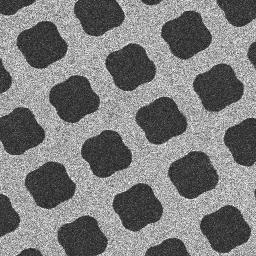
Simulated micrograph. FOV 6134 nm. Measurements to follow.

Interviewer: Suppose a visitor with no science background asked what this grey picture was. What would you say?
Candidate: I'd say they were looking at a regular array of holes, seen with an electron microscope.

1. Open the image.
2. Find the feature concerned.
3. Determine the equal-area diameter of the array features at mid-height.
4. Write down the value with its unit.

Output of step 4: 1110 nm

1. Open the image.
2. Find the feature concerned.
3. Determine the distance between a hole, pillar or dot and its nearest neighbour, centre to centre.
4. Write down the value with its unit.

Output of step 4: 1.49 µm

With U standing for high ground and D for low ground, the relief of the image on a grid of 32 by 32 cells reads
DDDDUUUUUDDDDDDUUUDDUUUUUUUDDDDD
DDUUUUUUUDDDDDDUUUUUUUUDDUUUDDDD
UUUUUUUUUUDDDDDDUUUUUDDDDUUUDDDD
UUUUDDDUUUDDDDUUUUUUDDDDDDUUUUUU
UUDDDDDDUUUDDUUUUUUUDDDDDDUUUUUU
UUDDDDDDUUUUUUUUDUUUUDDDDDUUUUUD
UUUDDDDDUUUUUUDDDDUUUDDDDUUUUUUD
UUUDDDDUUUUUUDDDDDDUUUUUUUUUUUUD
DUUUDDUUUUUUUDDDDDDUUUUUUUDDDUUU
DUUUUUUUUDUUUUDDDDDUUUUUUDDDDDUU
DUUUUUUDDDDUUUDDDDUUUUUUDDDDDDUU
UUUUUUDDDDDDUUUUUUUUUUUUDDDDDDUU
UUUUUUDDDDDDUUUUUUUDDDUUUDDDDDUU
UUDUUUUDDDDDUUUUUUDDDDUUUUDDUUUU
DDDDUUUDDDDUUUUUUDDDDDDUUUUUUUUU
DDDDDUUUUUUUUUUUUDDDDDDUUUUUUUDD
DDDDDDUUUUUUUDDUUUDDDDDUUUUUDDDD
DDDDDUUUUUUDDDDUUUUDDUUUUUUUDDDD
UDDDUUUUUUDDDDDDUUUUUUUUUUUUDDDD
UUUUUUUUUUDDDDDDUUUUUUUDDDUUUDDD
UUUUUDDDUUUDDDDDUUUUUDDDDDUUUUDD
UUUUDDDDUUUUDDUUUUUUUDDDDDDUUUUU
UUUDDDDDDUUUUUUUUUUUUDDDDDDUUUUU
UUUDDDDDDUUUUUUUDDDUUUDDDDDUUUUU
DUUUDDDDDUUUUUDDDDDUUUUDDUUUUUUU
DUUUUDDUUUUUUUDDDDDDUUUUUUUUUUUU
DDUUUUUUUUUUUUDDDDDDUUUUUUUDDDUU
DDDUUUUUUDDDUUUDDDDDUUUUUDDDDDDU
DDUUUUUUDDDDUUUUDDUUUUUUUDDDDDDU
UUUUUUUDDDDDDUUUUUUUUUUUUUDDDDDU
UUUUUUUDDDDDDUUUUUUUDDDUUUDDDDUU
UUUDDUUUDDDDDUUUUUDDDDDDUUUDDUUU